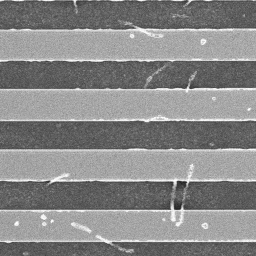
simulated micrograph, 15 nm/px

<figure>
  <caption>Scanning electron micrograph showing lines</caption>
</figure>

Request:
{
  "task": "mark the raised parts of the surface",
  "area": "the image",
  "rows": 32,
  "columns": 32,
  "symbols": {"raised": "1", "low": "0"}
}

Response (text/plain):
00000000000000000000000000000000
00000000000000000000000000000000
00000000000000000000000000000000
00000000000000000000000000000000
11111111111111111111111111111111
11111111111111111111111111111111
11111111111111111111111111111111
10011110111110110111010000000000
00000000000000000000000000000000
00000000000000000000000000000000
00000000000000000000000000000000
11111111111111111111111111111111
11111111111111111111111111111111
11111111111111111111111111111111
11111111111111111111111111111111
00000000000000000000000000000000
00000000000000000000000000000000
00000000000000000000000000000000
00000000000000000000000000000000
11111111111111111111111111111111
11111111111111111111111111111111
11111111111111111111111111111111
11111111111111111111111111111111
00000000000000000000000000000000
00000000000000000000000000000000
00000000000000000000000000000000
11111111111111111111111111111111
11111111111111111111111111111111
11111111111111111111111111111111
11111111111111111111111111111111
00000000000000000000000000000000
00000000000000000000000000000000